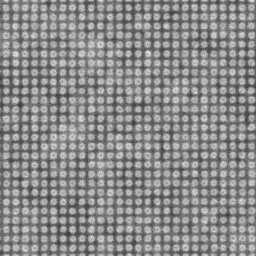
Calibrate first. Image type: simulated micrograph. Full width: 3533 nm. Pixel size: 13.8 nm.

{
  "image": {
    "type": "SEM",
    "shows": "a regular array of raised bodies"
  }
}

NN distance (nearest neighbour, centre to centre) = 125 nm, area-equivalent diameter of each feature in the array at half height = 69.6 nanometres